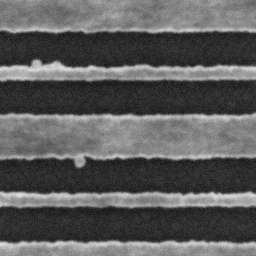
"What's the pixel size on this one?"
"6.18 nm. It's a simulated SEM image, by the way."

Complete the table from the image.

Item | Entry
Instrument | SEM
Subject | lines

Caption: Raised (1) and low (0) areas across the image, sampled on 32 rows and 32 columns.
11111111111111111111111111111111
11111111111111111111111111111111
11111111111111111111111111111111
11111111111111111111111111111111
00000000000000000000000000000000
00000000000000000000000000000000
00000000000000000000000000000000
00000000000000000000000000000000
11110101000110011110111111111111
11111111111111111111111111111111
00000000000000000000000000000000
00000000000000000000000000000000
00000000000000000000000000000000
00000000000000000000000000000000
11110101100111001001001111001011
11111111111111111111111111111111
11111111111111111111111111111111
11111111111111111111111111111111
11111111111111111111111111111111
11111111110111111111111111111111
00000000000000000000000000000000
00000000000000000000000000000000
00000000000000000000000000000000
00000000000000000000000000000000
11111111111111111111111111111111
11111111111111111111111111111111
00000000000000000000000000000000
00000000000000000000000000000000
00000000000000000000000000000000
00000000000000000000000000000000
10111111111111111110111111111001
11111111111111111111111111111111